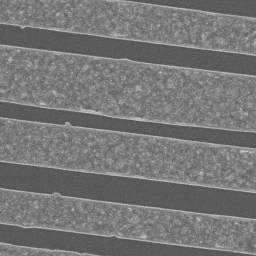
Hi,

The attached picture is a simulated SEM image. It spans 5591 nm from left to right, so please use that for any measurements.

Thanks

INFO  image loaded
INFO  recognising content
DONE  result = one or a few lines or trenches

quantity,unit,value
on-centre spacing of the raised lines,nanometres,1420